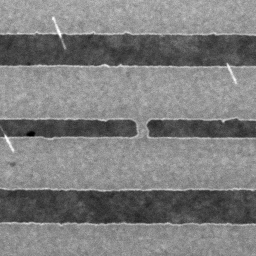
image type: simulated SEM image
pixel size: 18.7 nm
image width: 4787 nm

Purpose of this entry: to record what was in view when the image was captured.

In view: one or a few lines or trenches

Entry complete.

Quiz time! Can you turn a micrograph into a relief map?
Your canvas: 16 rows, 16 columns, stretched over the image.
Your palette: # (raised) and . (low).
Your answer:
################
################
................
................
################
################
################
........##......
........##......
################
################
################
................
................
################
################